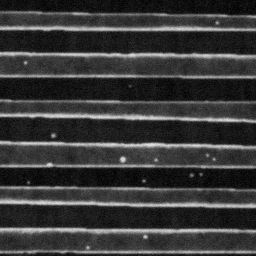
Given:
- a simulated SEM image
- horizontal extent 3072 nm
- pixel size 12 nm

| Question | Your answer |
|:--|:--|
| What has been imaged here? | lines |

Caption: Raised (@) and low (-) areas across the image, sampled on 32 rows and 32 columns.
--------------------------------
--------------------------------
@@@@@@@@@@@@@@@@@@@@@@@@@@@@@@@@
@@@@@@@@@@@@@@@@@@@@@@@@@@@@@@@@
--------------------------------
--------------------------------
--------------------------------
@@@@@@@@@@@@@@@@@@@@@@@@@@@@@@@@
@@@@@@@@@@@@@@@@@@@@@@@@@@@@@@@@
@@@@@@@@@@@@@@@@@@@@@@@@@@@@@@@@
--------------------------------
--------------------------------
--------------------------------
@@@@@@@@@@@@@@@@@@@@@@@@@@@@@@@@
@@@@@@@@@@@@@@@@@@@@@@@@@@@@@@@@
--------------------------------
--------------------------------
--------------------------------
@@@@@@@@@@@@@@@@@@@@@@@@@@@@@@@@
@@@@@@@@@@@@@@@@@@@@@@@@@@@@@@@@
@@@@@@@@@@@@@@@@@@@@@@@@@@@@@@@@
--------------------------------
--------------------------------
@@@@@@@@@@----------------------
@@@@@@@@@@@@@@@@@@@@@@@@@@@@@@@@
-------@@@@@@@@@@@@@@@@@@@@@@@@@
--------------------------------
--------------------------------
--------------------------------
@@@@@@@@@@@@@@@@@@@@@@@@@@@@@@@@
@@@@@@@@@@@@@@@@@@@@@@@@@@@@@@@@
@@@------@@@@@@@@@@@@@@@@@@@@@@@